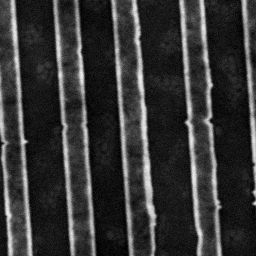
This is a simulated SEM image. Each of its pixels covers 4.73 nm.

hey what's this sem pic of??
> one or a few lines or trenches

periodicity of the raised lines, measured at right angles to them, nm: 297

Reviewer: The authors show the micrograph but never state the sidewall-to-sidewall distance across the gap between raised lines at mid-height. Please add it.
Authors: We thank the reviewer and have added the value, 0.195 microns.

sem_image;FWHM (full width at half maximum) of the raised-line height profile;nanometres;104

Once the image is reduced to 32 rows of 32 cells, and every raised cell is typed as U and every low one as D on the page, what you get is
UUDDDDDUUUDDDDUUUDDDDDDUUDDDDDDU
UUDDDDDUUUDDDDUUUDDDDDDUUDDDDDDU
UUDDDDDUUUDDDDUUUDDDDDDUUDDDDDDU
UUDDDDDUUUDDDDUUUDDDDDDUUDDDDDDU
UUDDDDDUUUDDDDUUUDDDDDDUUUDDDDDU
UUDDDDDUUUDDDDDUUDDDDDDUUUDDDDDU
UUDDDDDUUUDDDDDUUDDDDDDUUUDDDDDU
UUDDDDDUUUDDDDDUUDDDDDDUUUDDDDDU
UUDDDDDUUUDDDDDUUUDDDDDUUUDDDDDU
UUDDDDDUUUDDDDDUUUDDDDDUUUDDDDDU
UUDDDDDDUUDDDDDUUUDDDDDUUUDDDDDU
UUDDDDDDUUDDDDDUUUDDDDDUUUDDDDDU
UUDDDDDDUUDDDDDUUUDDDDDDUUDDDDDU
UUUDDDDDUUUDDDDUUUDDDDDDUUDDDDDU
UUUDDDDDUUUDDDDUUUDDDDDDUUDDDDDU
UUUDDDDDUUUDDDDUUUDDDDDDUUDDDDDD
UUUDDDDDUUUDDDDUUUDDDDDDUUDDDDDD
UUUDDDDDUUUDDDDUUUDDDDDDUUDDDDDD
UUUDDDDDUUUDDDDUUUDDDDDDUUUDDDDD
UUUDDDDDUUUDDDDDUUDDDDDDUUUDDDDD
UUUDDDDDUUUDDDDDUUDDDDDDUUUDDDDD
DUUDDDDDUUUDDDDDUUDDDDDDUUUDDDDD
DUUDDDDDUUUDDDDDUUDDDDDDUUUDDDDD
DUUDDDDDDUUDDDDDUUUDDDDDUUUDDDDD
DUUDDDDDDUUDDDDDUUUDDDDDUUUDDDDD
DUUDDDDDDUUDDDDDUUUDDDDDUUUDDDDD
DUUDDDDDDUUDDDDDUUUDDDDDDUUDDDDD
DUUUDDDDDUUUDDDDUUUDDDDDDUUDDDDD
DUUUDDDDDUUUDDDDUUUDDDDDDUUDDDDD
DUUUDDDDDUUUDDDDUUUDDDDDDUUDDDDD
DUUUDDDDDUUUDDDDUUUDDDDDDUUDDDDD
DUUUDDDDDUUUDDDDUUUDDDDDDUUUDDDD